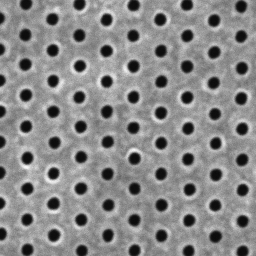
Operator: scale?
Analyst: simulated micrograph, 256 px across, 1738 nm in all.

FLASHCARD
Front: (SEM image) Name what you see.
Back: a regular array of holes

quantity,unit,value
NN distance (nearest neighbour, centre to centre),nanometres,206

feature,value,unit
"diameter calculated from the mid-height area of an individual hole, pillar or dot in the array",0.0833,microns